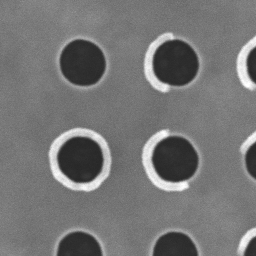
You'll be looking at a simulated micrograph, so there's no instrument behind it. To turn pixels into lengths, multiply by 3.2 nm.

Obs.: holes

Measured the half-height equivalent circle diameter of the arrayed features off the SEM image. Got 150 nm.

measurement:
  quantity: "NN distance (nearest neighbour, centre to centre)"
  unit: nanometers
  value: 301